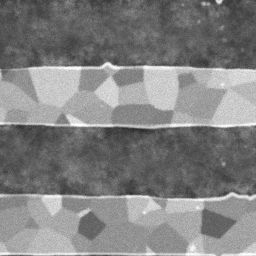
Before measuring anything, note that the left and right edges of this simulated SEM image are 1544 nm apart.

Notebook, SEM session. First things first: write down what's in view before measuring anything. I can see one or a few lines or trenches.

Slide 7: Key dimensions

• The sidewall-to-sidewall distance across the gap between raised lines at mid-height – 429 nm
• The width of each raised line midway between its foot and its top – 346 nm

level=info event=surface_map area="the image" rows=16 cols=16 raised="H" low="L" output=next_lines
LLLLLLLLLLLLLLLL
LLLLLLLLLLLLLLLL
LLLLLLLLLLLLLLLL
LLLLLLLLLLLLLLLL
HHHHHHHHHHHHHHHH
HHHHHHHHHHHHHHHH
HHHHHHHHHHHHHHHH
HHHHHHHHHHHHHHHH
LLLLLLLLLLLLLLLL
LLLLLLLLLLLLLLLL
LLLLLLLLLLLLLLLL
LLLLLLLLLLLLLLLL
HHHHHHHHHHHHLHHH
HHHHHHHHHHHHHHHH
HHHHHHHHHHHHHHHH
HHHHHHHHHHHHHHHH